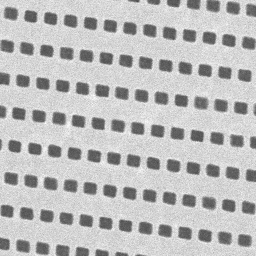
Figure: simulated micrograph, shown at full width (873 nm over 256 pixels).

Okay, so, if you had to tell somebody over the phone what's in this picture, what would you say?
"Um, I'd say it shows a regular array of holes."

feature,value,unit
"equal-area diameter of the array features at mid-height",49.2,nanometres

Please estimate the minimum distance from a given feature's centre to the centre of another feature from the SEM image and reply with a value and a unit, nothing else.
67.7 nanometres